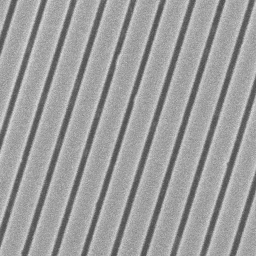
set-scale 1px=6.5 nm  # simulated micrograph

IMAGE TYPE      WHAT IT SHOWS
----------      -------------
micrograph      parallel lines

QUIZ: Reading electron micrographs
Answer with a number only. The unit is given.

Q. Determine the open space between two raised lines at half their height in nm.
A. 41.1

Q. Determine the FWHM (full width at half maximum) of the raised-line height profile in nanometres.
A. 140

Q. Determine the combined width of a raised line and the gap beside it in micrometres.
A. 0.185